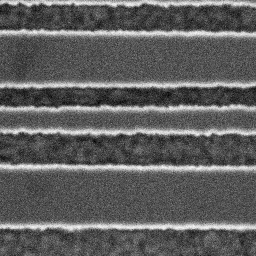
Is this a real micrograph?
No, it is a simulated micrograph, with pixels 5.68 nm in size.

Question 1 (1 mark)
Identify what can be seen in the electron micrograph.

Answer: lines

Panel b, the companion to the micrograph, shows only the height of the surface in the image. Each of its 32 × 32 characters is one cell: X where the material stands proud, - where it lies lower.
-X-X--XXXXXXXXXXXX-XXXXXXXXX-XXX
--------------------------------
--------------------------------
--------------------------------
XXXXXXXXXXXXXXXXXXXXXXXXXXXXXXXX
XXXXXXXXXXXXXXXXXXXXXXXXXXXXXXXX
XXXXXXXXXXXXXXXXXXXXXXXXXXXXXXXX
XXXXXXXXXXXXXXXXXXXXXXXXXXXXXXXX
XXXXXXXXXXXXXXXXXXXXXXXXXXXXXXXX
XXXXXXXXXXXXXXXXXXXXXXXXXXXXXXXX
XXXXXXXXXXXXXXXXXXXXXXXXXXXXXXXX
--------------------------------
--------------------------------
XXXXXXXXXXXXXXXXXXXXXXXXXXXXXXXX
XXXXXXXXXXXXXXXXXXXXXXXXXXXXXXXX
XXXXXXXXXXXXXXXXXXXXXXXXXXXXXXXX
XXXXXXXXXXXXXXXXXXXXXXXXXXXXXXXX
--------------------------------
--------------------------------
--------------------------------
--------------------------------
XXXXXXXXXXXXXXXXXXXXXXXXXXXXXXXX
XXXXXXXXXXXXXXXXXXXXXXXXXXXXXXXX
XXXXXXXXXXXXXXXXXXXXXXXXXXXXXXXX
XXXXXXXXXXXXXXXXXXXXXXXXXXXXXXXX
XXXXXXXXXXXXXXXXXXXXXXXXXXXXXXXX
XXXXXXXXXXXXXXXXXXXXXXXXXXXXXXXX
XXXXXXXXXXXXXXXXXXXXXXXXXXXXXXXX
XXX-XX--XXX-XXXXXXXXXXXXXXXXXXXX
--------------------------------
--------------------------------
--------------------------------